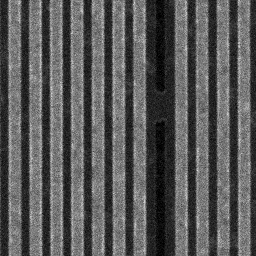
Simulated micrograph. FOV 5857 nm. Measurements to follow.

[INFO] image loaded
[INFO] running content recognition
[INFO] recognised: parallel lines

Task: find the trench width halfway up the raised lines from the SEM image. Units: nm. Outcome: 229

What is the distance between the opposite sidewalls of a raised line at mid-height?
246 nm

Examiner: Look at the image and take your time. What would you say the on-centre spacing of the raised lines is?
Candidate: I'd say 0.477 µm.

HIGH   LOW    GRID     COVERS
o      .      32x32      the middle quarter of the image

..ooo..ooo..ooo...oo...oo...oo..
..ooo..ooo..ooo...oo...oo...oo..
..ooo..ooo..ooo...oo...oo...ooo.
..ooo..ooo..ooo...oo...oo...ooo.
..ooo..ooo..ooo...oo...oo...ooo.
..ooo..ooo..ooo...oo...oo...ooo.
..ooo..ooo..ooo...oo...oo...ooo.
..ooo..ooo..ooo...oo........ooo.
..ooo..ooo..ooo...oo........ooo.
..ooo..ooo..ooo...oo........ooo.
..ooo..ooo..ooo...oo........ooo.
..ooo..ooo..ooo...oo........ooo.
..ooo..ooo..ooo...oo........ooo.
..ooo..ooo..ooo...oo........ooo.
..ooo..ooo..ooo...oo...oo...ooo.
..ooo..ooo..ooo...oo...oo...ooo.
..ooo..ooo..ooo...oo...oo...ooo.
..ooo..ooo..ooo...oo...oo...ooo.
..ooo..ooo..ooo...oo...oo...ooo.
..ooo..ooo..ooo...oo...oo...ooo.
..ooo..ooo..ooo...oo...oo...ooo.
..ooo..ooo...oo...oo...oo...ooo.
..ooo..ooo...oo...oo...oo...ooo.
..ooo..ooo...oo...oo...oo...ooo.
..ooo..ooo...oo...oo...oo...ooo.
..ooo..ooo...oo...oo...oo...ooo.
..ooo..ooo...oo...oo...oo...ooo.
..ooo..ooo...oo...oo...oo...ooo.
..ooo..ooo...oo...oo...oo...ooo.
..ooo..ooo...oo...oo...oo...ooo.
..ooo..ooo...oo...oo...oo...ooo.
..ooo..ooo...oo...oo...oo...ooo.